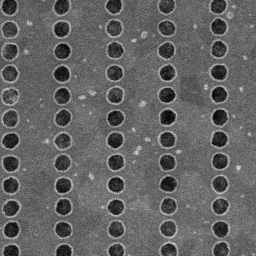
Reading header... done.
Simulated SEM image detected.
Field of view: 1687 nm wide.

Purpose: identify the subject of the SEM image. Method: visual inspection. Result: a regular array of holes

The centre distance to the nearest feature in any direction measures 145 nm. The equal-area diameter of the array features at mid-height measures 112 nm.